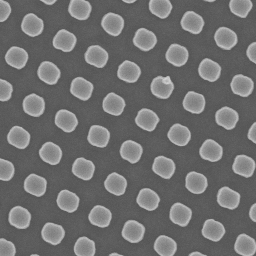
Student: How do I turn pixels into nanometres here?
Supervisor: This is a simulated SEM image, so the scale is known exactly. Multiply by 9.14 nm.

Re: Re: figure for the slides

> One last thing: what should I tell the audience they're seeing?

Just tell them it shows a regular array of raised bodies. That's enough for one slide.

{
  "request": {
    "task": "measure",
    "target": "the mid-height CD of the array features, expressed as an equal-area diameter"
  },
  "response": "199 nanometers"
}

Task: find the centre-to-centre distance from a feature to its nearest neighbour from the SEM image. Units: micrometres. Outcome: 0.325